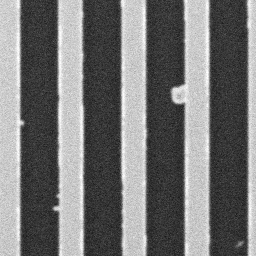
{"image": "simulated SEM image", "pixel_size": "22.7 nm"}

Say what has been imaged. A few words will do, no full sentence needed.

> lines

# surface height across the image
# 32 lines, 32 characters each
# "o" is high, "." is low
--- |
oo.....ooo.....ooo.....ooo.....o
oo.....ooo.....ooo.....ooo.....o
oo.....ooo.....ooo.....ooo.....o
oo.....ooo.....ooo.....ooo.....o
oo.....ooo.....ooo.....ooo.....o
oo.....ooo.....ooo.....ooo.....o
oo.....ooo.....ooo.....ooo.....o
oo.....ooo.....ooo.....ooo.....o
oo.....ooo.....ooo.....ooo.....o
oo.....ooo.....ooo.....ooo.....o
oo.....ooo.....ooo.....ooo.....o
oo.....ooo.....ooo.....ooo.....o
oo......oo.....ooo.....ooo.....o
oo.....ooo.....ooo.....ooo.....o
oo.....ooo.....ooo.....ooo.....o
oo.....ooo.....ooo.....ooo.....o
oo.....ooo.....ooo.....ooo.....o
oo.....ooo.....ooo.....ooo.....o
oo......oo.....ooo.....ooo.....o
oo.....ooo.....ooo.....ooo.....o
oo.....ooo.....ooo.....ooo.....o
oo......oo.....ooo.....ooo.....o
oo......oo.....ooo.....ooo.....o
oo......oo.....ooo.....ooo.....o
oo......oo.....ooo.....ooo.....o
oo......oo.....ooo.....ooo.....o
oo......oo.....ooo.....ooo.....o
oo......oo.....ooo.....ooo.....o
oo......oo.....ooo.....ooo.....o
oo......oo.....ooo.....ooo.....o
oo......oo.....ooo.....ooo.....o
oo......oo.....ooo.....ooo.....o